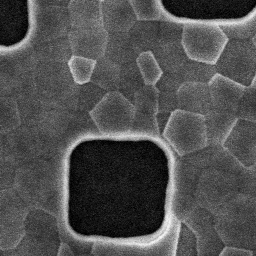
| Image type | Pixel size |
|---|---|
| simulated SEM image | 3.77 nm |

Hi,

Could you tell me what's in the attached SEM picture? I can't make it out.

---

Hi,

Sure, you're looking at holes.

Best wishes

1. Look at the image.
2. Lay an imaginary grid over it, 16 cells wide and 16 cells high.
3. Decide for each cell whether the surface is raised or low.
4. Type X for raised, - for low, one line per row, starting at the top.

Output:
--XXXXXXXX------
--XXXXXXXXXXXXXX
-XXXXXXXXXXXXXXX
XXXXXXXXXXXXXXXX
XXXXXXXXXXXXXXXX
XXXXXXXXXXXXXXXX
XXXXXXXXXXXXXXXX
XXXXXXXXXXXXXXXX
XXXXXXXXXXXXXXXX
XXXX------XXXXXX
XXXX-------XXXXX
XXXX-------XXXXX
XXXX-------XXXXX
XXXX------XXXXXX
XXXXX-----XXXXXX
XXXXXXXXXXXXXXXX